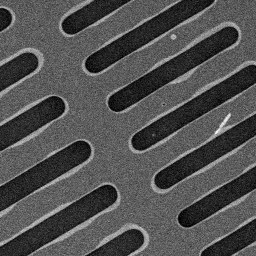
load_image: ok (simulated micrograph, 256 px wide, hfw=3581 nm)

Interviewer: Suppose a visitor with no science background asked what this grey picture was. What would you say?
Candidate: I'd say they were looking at groups of lines, slits or small figures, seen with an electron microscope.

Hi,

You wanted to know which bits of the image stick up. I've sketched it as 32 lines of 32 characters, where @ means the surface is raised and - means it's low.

@@@@@@@@@@------@@@@@@-----@@@@@
-@@@@@@@@-----@@@@@@-----@@@@@@@
--@@@@@@-----@@@@@------@@@@@@@@
-@@@@@@@---@@@@@@-----@@@@@---@@
@@@@@@@@@@@@@@@-----@@@@@@----@@
@@@@@@@@@@@@@------@@@@@-----@@@
@@@-@@@@@@@@-----@@@@@@-----@@@@
@----@@@@@@----@@@@@@-----@@@@@@
-----@@@@@@---@@@@@-----@@@@@@--
----@@@@@@@@@@@@@@-----@@@@@@---
--@@@@@@@@@@@@@@-----@@@@@@-----
@@@@@@@@@@@@@@-----@@@@@@-----@@
@@@@@---@@@@@-----@@@@@@-----@@@
@@@-----@@@@@@--@@@@@@-----@@@@@
@@------@@@@@@@@@@@@-----@@@@@@-
------@@@@@@@@@@@@@-----@@@@@@--
-----@@@@@@@@@@@@-----@@@@@-----
---@@@@@@@@@@@@@-----@@@@@-----@
-@@@@@@@---@@@@@@--@@@@@@-----@@
@@@@@@-----@@@@@@@@@@@@-----@@@@
@@@@@-----@@@@@@@@@@@------@@@@@
@@@------@@@@@@@@@@@-----@@@@@@-
@------@@@@@@@@@@@@----@@@@@@---
-----@@@@@@@--@@@@@--@@@@@@-----
---@@@@@@@-----@@@@@@@@@@------@
--@@@@@@@-----@@@@@@@@@@-----@@@
-@@@@@@------@@@@@@@@@@----@@@@@
@@@@@------@@@@@@@@@@@---@@@@@@-
@@@@------@@@@@@-@@@@@@@@@@@@@--
@@------@@@@@@----@@@@@@@@@@----
------@@@@@@@-----@@@@@@@@------
----@@@@@@@------@@@@@@@@-----@@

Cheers